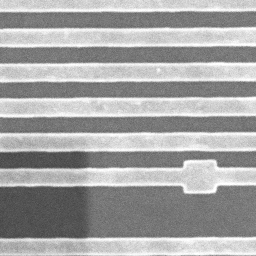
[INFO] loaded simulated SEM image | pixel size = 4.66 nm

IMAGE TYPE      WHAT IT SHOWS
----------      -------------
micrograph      wiring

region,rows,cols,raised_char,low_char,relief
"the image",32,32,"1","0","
11111111111111111111111111111111
00000000000000000000000000000000
00000000000000000000000000000000
00000000000000000000000000000000
11111111111111111111111111111111
11111111111111111111111111111111
00000000000000000000000000000000
00000000000000000000000000000000
11111111111111111111111111111111
11111111111111111111111111111111
00000000000000000000000000000000
00000000000000000000000000000000
11111111111111111111111111111111
11111111111111111111111111111111
00000000000000000000000000000000
00000000000000000000000000000000
00000000000000000000000000000000
11111111111111111111111111111111
11111111111111111111111111111111
00000000000000000000000000000000
00000000000000000000000111100000
11111111111111111111111111111111
11111111111111111111111111111111
00000000000000000000000111100000
00000000000000000000000000000000
00000000000000000000000000000000
00000000000000000000000000000000
00000000000000000000000000000000
00000000000000000000000000000000
00000000000000000000000000000000
11111111111111111111111111111111
11111111111111111111111111111111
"